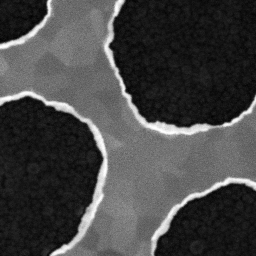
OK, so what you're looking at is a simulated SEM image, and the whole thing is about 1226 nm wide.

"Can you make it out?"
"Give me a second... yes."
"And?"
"holes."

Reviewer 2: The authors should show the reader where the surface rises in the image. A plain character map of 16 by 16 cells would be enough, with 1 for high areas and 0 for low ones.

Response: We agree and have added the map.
0001111000000000
0011111000000000
0111111000000000
1111111000000000
1111111000000000
1111111100000000
0001111100000000
0000011110000001
0000001111111111
0000001111111111
0000001111111111
0000001111111100
0000001111110000
0000001111100000
0000011111000000
0000111111000000